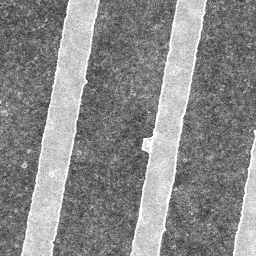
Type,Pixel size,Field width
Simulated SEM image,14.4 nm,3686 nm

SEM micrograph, one or a few lines or trenches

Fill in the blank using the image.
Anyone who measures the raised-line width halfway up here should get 413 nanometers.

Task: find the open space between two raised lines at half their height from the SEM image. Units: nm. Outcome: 1120